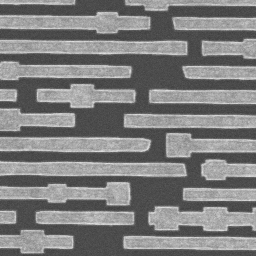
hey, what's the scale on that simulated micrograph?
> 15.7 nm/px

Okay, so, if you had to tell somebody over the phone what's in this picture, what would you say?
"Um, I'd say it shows wiring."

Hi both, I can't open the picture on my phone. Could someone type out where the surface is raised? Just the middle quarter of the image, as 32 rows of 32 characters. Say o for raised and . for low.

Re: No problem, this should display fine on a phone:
ooooooooooo.....................
ooooooooooooooooo.............oo
ooooooooooooooooo.............oo
...............................o
................................
..ooooo.........................
.ooooooo........................
oooooooooooooooooo....oooooooooo
oooooooooooooooooo....oooooooooo
.ooooooo........o.....oooooooooo
..ooooo.........................
................................
oo..............................
ooo............ooooooooooooooooo
ooo............ooooooooooooooooo
oo.............ooooooooooooooooo
................................
..........................ooooo.
..........................oooooo
oooooooooooooooooooooo....oooooo
ooooooooooooooooooooo.....oooooo
ooooooooooooooooooooo.....oooooo
..........................oooooo
................................
................................
oooooooooooooooooooooooooooooo..
oooooooooooooooooooooooooooooo..
ooooooooooooooooooooooooooooooo.
................................
................................
o..........ooooo................
oooooooooooooooo..............oo